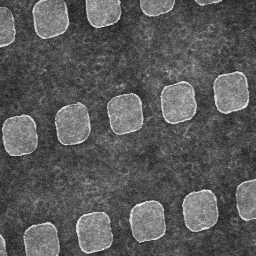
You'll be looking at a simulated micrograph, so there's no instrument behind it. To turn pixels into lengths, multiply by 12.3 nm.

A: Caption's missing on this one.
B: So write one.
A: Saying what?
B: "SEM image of a regular array of raised bodies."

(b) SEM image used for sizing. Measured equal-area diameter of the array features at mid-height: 477 nanometers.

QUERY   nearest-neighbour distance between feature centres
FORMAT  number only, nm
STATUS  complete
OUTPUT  662